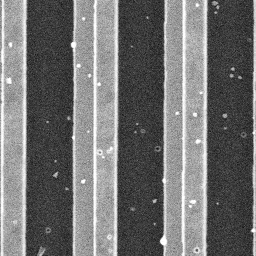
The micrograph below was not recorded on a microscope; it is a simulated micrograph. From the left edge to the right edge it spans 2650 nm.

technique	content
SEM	lines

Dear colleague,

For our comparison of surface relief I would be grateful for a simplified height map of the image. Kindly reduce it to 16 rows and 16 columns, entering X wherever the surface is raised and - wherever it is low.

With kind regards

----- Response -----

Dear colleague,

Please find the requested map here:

XX---XX---XXX---
XX---XX---XXX---
XX---XX---XXX---
XX---XX---XXX---
XX---XX---XXX---
XX---XX---XXX---
XX---XX---XXX---
XX---XX---XXX---
XX---XX---XXX---
XX---XX---XXX---
XX---XX---XXX---
XX---XX---XXX---
X----XX---XXX---
X----XX---XXX---
X----XX---XXX---
X----XX---XXX---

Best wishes